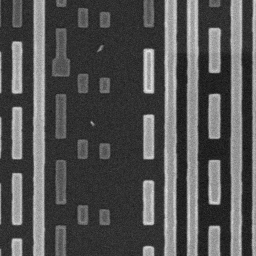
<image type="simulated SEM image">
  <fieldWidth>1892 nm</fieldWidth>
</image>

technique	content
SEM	wiring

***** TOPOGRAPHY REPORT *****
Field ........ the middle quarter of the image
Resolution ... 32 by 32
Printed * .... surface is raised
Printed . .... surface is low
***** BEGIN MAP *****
*...................**....**...*
*...................**....**...*
*...................**....**...*
....**..............**....**...*
....**...**.........**....**...*
....**...**.........**....**...*
....**...**.........**....**...*
..........................**...*
..........................**...*
..........................**...*
..........................**...*
..........................**...*
..........................**...*
....................**....**...*
....................**....**...*
....................**....**...*
....................**....**...*
....................**....**...*
....................**....**...*
....**..............**....**...*
....**...**.........**....**...*
....**...**.........**.........*
....**...**.........**.........*
...............................*
................................
................................
................................
................................
................................
................................
................................
................................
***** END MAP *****